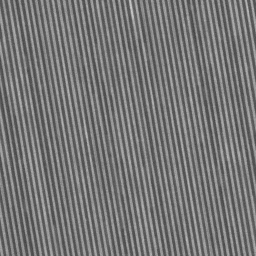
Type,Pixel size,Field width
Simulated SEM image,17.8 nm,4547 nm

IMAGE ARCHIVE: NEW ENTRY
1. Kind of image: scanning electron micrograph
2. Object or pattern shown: parallel lines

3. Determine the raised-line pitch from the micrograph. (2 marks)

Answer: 96.5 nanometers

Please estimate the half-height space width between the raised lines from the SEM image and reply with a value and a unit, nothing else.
63.5 nm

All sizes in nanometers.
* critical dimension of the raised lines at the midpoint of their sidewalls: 32.8